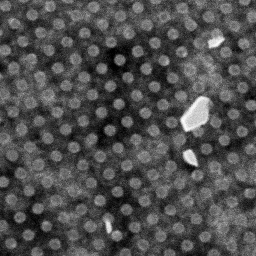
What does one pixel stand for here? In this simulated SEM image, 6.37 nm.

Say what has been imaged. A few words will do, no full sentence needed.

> a regular array of raised bodies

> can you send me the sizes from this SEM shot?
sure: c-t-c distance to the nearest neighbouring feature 124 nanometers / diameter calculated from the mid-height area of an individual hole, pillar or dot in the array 65.9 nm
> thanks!